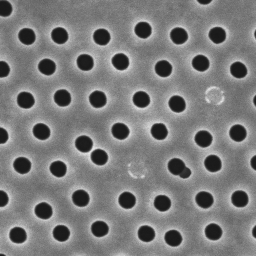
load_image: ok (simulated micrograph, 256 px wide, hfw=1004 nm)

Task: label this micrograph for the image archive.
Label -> a regular array of holes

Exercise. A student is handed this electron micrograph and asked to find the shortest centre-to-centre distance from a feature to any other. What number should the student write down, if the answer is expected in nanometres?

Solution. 132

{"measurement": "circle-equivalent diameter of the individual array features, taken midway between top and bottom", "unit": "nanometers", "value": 62.1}